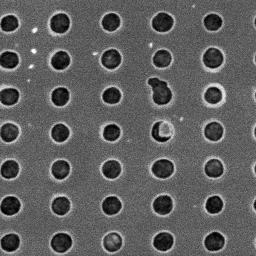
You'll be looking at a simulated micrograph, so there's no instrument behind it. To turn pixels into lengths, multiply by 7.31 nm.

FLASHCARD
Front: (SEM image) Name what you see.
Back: a regular array of holes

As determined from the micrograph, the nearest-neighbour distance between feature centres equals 266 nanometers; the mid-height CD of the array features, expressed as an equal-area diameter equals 0.144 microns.